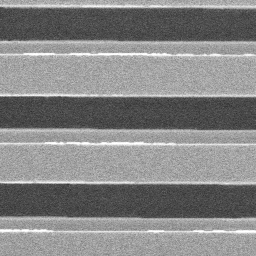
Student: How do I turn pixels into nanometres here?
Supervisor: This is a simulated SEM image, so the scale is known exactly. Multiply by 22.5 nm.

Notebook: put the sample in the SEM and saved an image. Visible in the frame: lines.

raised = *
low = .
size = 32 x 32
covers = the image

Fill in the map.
********************************
................................
................................
................................
................................
********************************
********************************
********************************
********************************
********************************
********************************
********************************
................................
................................
................................
................................
********************************
********************************
********************************
********************************
********************************
********************************
********************************
................................
................................
................................
................................
********************************
********************************
********************************
********************************
********************************